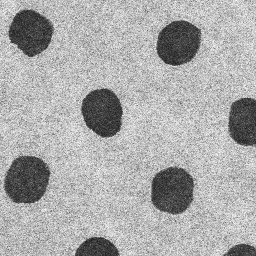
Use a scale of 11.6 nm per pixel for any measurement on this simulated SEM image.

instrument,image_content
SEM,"holes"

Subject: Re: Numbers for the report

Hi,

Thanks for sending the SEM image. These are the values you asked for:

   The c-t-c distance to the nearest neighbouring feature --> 1200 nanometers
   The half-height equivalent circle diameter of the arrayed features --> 520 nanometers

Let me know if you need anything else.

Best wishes